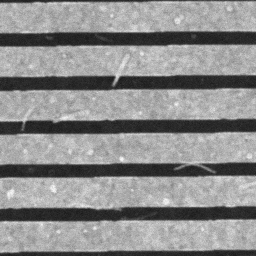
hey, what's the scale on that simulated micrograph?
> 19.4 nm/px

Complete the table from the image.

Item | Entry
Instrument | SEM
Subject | lines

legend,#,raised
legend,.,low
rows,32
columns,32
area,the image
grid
################################
################################
################################
################################
................................
................................
################################
################################
################################
######..#.....#.................
................................
################################
################################
################################
################################
................................
................................
################################
################################
################################
................................
................................
################################
################################
################################
################################
................................
................................
################################
################################
################################
................................